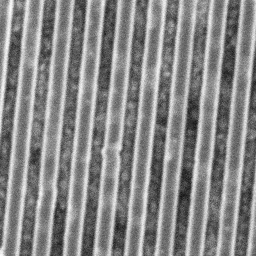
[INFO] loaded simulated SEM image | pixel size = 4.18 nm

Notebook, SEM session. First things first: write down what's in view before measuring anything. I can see parallel lines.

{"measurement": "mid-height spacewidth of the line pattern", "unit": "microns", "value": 0.0602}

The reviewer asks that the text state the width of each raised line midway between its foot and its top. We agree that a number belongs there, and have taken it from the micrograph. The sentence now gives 0.068 µm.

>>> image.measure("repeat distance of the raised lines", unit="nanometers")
128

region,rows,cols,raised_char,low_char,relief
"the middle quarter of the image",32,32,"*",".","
*....****...****....****....****
*...****....****....****....***.
....****....****....****...****.
....****....****....****...****.
....****....****...****....****.
....****....****...****....****.
....****....****...****....****.
....****....***....****....****.
....****...****....****....****.
....****...****....****....****.
....***....****....****....****.
...****....****....****...*****.
...****....****....****....***..
...****....****....****...****..
...****....****....****...****..
...****....****...****....****..
...****....****...****....****..
...****....***....****....****..
...****...****....****....****..
...****...****....****....****..
...***....****....****....****..
..*****...****....****...*****..
..*****...****....****...****...
..****....****....****...****...
..****....****....****...****...
..****....****....***....****...
..****....****...****....****...
..****....****...****....****...
..****....***....****....****...
..****...****....****....****...
..***....****....****....****...
.****....****....****...*****...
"